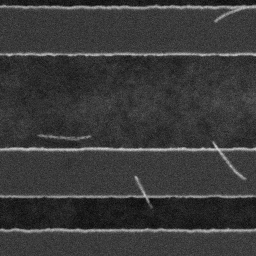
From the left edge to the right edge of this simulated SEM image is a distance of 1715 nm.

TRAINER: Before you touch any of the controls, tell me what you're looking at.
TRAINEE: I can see lines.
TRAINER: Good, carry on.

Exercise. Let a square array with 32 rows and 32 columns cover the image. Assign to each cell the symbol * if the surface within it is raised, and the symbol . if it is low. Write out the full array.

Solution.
................................
********************************
********************************
********************************
********************************
********************************
********************************
................................
................................
................................
................................
................................
................................
................................
................................
................................
................................
................................
................................
********************************
********************************
********************************
********************************
********************************
********************************
................................
................................
................................
................................
********************************
********************************
********************************